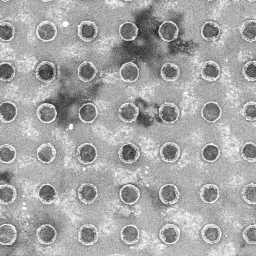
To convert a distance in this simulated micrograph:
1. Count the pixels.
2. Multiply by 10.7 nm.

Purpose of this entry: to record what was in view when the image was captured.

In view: a regular array of raised bodies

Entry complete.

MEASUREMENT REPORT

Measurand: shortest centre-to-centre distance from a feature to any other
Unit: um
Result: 0.432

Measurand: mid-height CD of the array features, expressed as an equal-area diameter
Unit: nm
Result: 206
